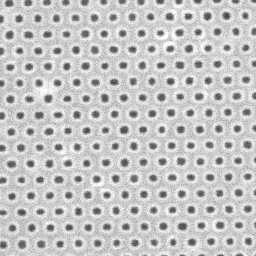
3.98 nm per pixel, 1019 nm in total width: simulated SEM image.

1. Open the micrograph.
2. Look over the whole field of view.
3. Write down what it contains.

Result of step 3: a regular array of holes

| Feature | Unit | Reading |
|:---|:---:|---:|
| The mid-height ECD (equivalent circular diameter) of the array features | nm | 35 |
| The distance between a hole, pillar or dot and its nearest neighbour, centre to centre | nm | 73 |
